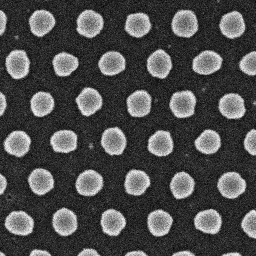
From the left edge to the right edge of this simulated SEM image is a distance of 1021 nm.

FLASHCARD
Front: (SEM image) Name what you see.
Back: a regular array of raised bodies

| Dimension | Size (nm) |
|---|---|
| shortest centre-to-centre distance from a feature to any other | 177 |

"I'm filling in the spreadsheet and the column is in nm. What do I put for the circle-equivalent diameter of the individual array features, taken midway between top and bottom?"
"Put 102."